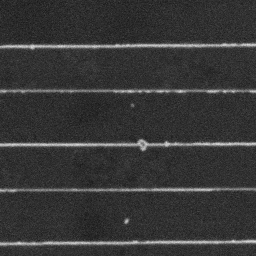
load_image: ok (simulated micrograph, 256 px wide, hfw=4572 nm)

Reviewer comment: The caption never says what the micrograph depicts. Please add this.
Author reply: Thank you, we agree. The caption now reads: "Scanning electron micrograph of lines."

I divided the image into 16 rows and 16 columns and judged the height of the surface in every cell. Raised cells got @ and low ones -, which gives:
----------------
----------------
----------------
@@@@@@@@@@@@@@@@
@@@@@@@@@@@@@@@@
@@@@@@@@@@@@@@@@
----------------
----------------
----------------
@@@@@@@@@@@@@@@@
@@@@@@@@@@@@@@@@
@@@@@@@@@@@@@@@@
----------------
----------------
----------------
@@@@@@@@@@@@@@@@